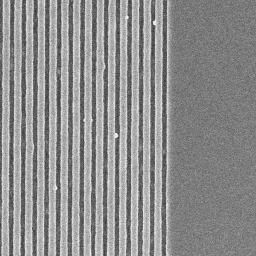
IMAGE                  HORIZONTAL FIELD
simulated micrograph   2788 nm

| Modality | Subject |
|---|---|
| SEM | parallel lines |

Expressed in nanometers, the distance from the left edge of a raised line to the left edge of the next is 128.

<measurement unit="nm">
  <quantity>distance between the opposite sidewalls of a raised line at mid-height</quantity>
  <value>73.5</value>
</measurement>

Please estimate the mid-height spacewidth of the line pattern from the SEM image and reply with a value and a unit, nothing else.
0.0531 microns